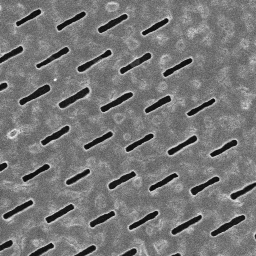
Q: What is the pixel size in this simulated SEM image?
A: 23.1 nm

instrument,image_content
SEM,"a regular array of holes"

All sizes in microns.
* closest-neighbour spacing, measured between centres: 0.954